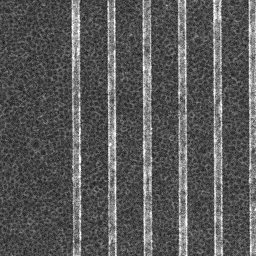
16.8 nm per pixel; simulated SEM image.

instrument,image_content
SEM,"parallel lines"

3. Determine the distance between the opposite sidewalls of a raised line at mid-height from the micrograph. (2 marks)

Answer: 118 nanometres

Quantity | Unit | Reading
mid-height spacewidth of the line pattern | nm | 470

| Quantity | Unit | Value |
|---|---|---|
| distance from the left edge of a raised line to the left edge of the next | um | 0.597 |